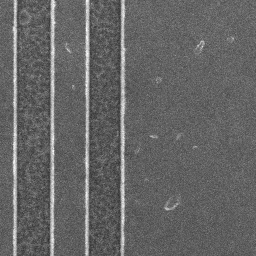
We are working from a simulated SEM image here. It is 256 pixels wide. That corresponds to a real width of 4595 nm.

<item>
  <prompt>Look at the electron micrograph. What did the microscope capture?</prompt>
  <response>one or a few lines or trenches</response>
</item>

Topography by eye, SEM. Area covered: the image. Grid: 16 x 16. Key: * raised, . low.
*..**...********
*..**...********
*..**...********
*..**...********
*..**...********
*..**...********
*..**...********
*..**...********
*..**...********
*..**...********
*..**...********
*..**...********
*..**...********
*..**...********
*..**...********
*..**...********